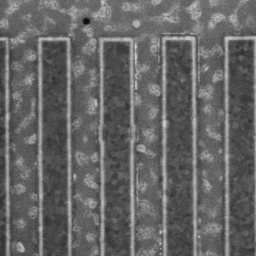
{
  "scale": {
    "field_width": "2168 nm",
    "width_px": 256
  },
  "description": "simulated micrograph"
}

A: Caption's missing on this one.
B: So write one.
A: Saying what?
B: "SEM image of one or a few lines or trenches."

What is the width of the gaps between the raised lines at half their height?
274 nm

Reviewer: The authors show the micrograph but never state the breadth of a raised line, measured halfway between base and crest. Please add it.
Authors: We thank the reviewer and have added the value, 254 nanometres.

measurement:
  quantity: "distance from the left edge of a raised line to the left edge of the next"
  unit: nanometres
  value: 528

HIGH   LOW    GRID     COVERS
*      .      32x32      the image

................................
................................
................................
................................
................................
*....***.....***.....***....****
*....****....***.....***....****
*....****....***.....***....****
*....****....***.....***....****
*....****....***.....***....****
*....****....***.....***....****
*....****....***.....***....****
*....****....***.....***....****
*....****....***.....***....****
*....****....***.....***....****
*....****....****....***....****
*....****....****....***....****
*....****....****....***....****
*....****....***.....***....****
*....****....***.....***....****
*....****....***.....***....****
*....****....***.....***....****
*....****....***.....***....****
*....****....***.....***....****
*....****....***.....***....****
*....****....***.....***....****
*....****....***.....***....****
*....****....***.....***....****
*....****....***.....***....****
*....****....****....***....****
*....****....****....***....****
*....****....****....***....****